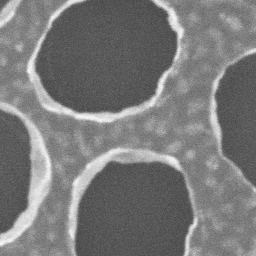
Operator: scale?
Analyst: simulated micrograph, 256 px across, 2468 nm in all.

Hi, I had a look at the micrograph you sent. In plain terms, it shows holes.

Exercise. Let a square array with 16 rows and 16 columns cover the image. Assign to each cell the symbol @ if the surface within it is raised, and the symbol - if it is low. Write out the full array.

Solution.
-@@@------@@@@@@
@@@--------@@@@@
@@@--------@@@@@
@@---------@@@@-
@@--------@@@@--
@@@-------@@@@--
@@@@-----@@@@---
--@@@@@@@@@@@@--
--@@@@@@@@@@@@--
---@@@@@-@@@@@--
---@@@-----@@@@-
--@@@-------@@@@
--@@@-------@@@@
-@@@@-------@@@@
@@@@@-------@@@@
@@@@@-------@@@@